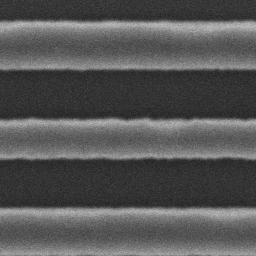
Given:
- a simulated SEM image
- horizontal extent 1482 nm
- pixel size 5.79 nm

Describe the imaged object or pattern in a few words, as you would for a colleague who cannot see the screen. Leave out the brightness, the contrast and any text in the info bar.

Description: lines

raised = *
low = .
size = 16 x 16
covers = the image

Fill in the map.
................
****************
****************
****************
................
................
................
..*...***...**..
****************
****************
................
................
................
****************
****************
****************